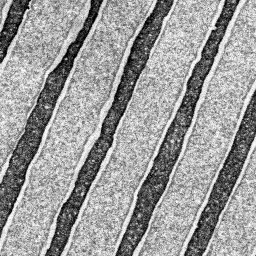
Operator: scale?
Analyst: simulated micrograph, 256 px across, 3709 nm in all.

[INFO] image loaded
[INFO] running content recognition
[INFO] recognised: one or a few lines or trenches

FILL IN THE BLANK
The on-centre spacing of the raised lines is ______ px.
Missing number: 64.6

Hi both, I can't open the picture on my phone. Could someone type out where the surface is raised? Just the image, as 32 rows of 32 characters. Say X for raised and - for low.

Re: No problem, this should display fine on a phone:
X---XXXXXXX--XXXXXX---XXXXXX--XX
X--XXXXXXXX--XXXXXX--XXXXXX---XX
---XXXXXXX--XXXXXX---XXXXXX--XXX
---XXXXXXX--XXXXX---XXXXXX---XXX
--XXXXXXX--XXXXXX---XXXXXX--XXXX
--XXXXXX---XXXXX---XXXXXX---XXXX
-XXXXXXX--XXXXXX---XXXXXX---XXXX
-XXXXXX---XXXXX----XXXXXX--XXXXX
XXXXXXX--XXXXXX---XXXXXX---XXXXX
XXXXXX---XXXXXX---XXXXXX--XXXXXX
XXXXX---XXXXXXX--XXXXXX---XXXXXX
XXXXX---XXXXXX---XXXXXX--XXXXXX-
XXXXX---XXXXXX--XXXXXXX--XXXXXX-
XXXX---XXXXXX---XXXXXX---XXXXXX-
XXXX---XXXXXX---XXXXXX--XXXXXX--
XXX---XXXXXXX--XXXXXX---XXXXXX--
XXX---XXXXXX---XXXXXX---XXXXX---
XX---XXXXXX---XXXXXX---XXXXXX---
XX---XXXXXX---XXXXXX---XXXXXX---
X----XXXXX----XXXXX----XXXXX---X
X---XXXXXX---XXXXXX---XXXXXX---X
----XXXXX----XXXXX----XXXXX---XX
---XXXXXX---XXXXXX---XXXXXX---XX
---XXXXXX--XXXXXX----XXXXX---XXX
---XXXXX---XXXXXX---XXXXXX---XXX
--XXXXXX---XXXXXX---XXXXXX---XXX
--XXXXX---XXXXXX---XXXXXX---XXXX
-XXXXXX---XXXXXX---XXXXXX---XXXX
-XXXXXX--XXXXXXX---XXXXX---XXXXX
XXXXXX---XXXXXX---XXXXXX---XXXXX
XXXXXX---XXXXXX---XXXXX---XXXXXX
XXXXX---XXXXXX---XXXXXX---XXXXXX